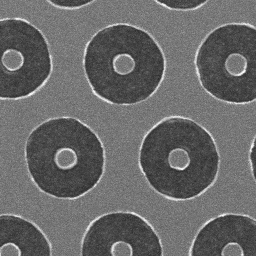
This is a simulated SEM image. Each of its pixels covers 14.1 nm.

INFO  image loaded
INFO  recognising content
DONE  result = ring-shaped grooves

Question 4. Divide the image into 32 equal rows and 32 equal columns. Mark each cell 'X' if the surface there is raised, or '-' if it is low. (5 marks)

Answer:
XXXXXXX----XXXXXXXXX-----XXXXXXX
XXXXXXXXXXXXXXXXXXXXXXXXXXXXXXXX
---XXXXXXXXXXXXXXXXXXXXXXXXXXXXX
----XXXXXXXXX----XXXXXXXXXX-----
-----XXXXXXX-------XXXXXXX------
------XXXXX---------XXXXX-------
-X----XXXXX---------XXXXX-------
XXX---XXXXX---XXX---XXXX----XXX-
-X----XXXXX---XXX---XXXXX---XXX-
------XXXXX---------XXXXX-------
-----XXXXXX---------XXXXX-------
----XXXXXXXX-------XXXXXXX------
XXXXXXXXXXXXX-----XXXXXXXXXX----
XXXXXXXXXXXXXXXXXXXXXXXXXXXXXXXX
XXXXXXXXXXXXXXXXXXXXXXXXXXXXXXXX
XXXXX-----XXXXXXXXXX-----XXXXXXX
XXXX--------XXXXXXX-------XXXXXX
XXX---------XXXXXX---------XXXXX
XXX----------XXXXX---------XXXXX
XXX----XX----XXXXX---XXX---XXXX-
XXX----XX----XXXXX---XXX---XXXX-
XXXX---------XXXXX---------XXXXX
XXXX--------XXXXXXX--------XXXXX
XXXXX------XXXXXXXX-------XXXXXX
XXXXXXX---XXXXXXXXXXX---XXXXXXXX
XXXXXXXXXXXXXXXXXXXXXXXXXXXXXXXX
XXXXXXXXXXXXXXXXXXXXXXXXXXXXXXXX
---XXXXXXXXX------XXXXXXXXX-----
-----XXXXXX--------XXXXXX-------
------XXXXX---------XXXXX-------
-X----XXXX----XX----XXXX-----X--
XXX---XXXX----XXX---XXXX----XX--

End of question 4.